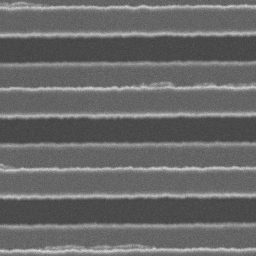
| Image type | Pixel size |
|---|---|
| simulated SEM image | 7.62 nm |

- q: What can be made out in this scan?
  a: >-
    lines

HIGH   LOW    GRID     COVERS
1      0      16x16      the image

1111111111111111
1111111111111111
0000000000000000
0000000000000000
1111111111111111
1111111111111111
1111111111111111
0000000000000000
0000000000000000
1111111111111111
1111111111111111
1111111111111111
0000000000000000
0000000000000000
1111111111111111
1111111111111111